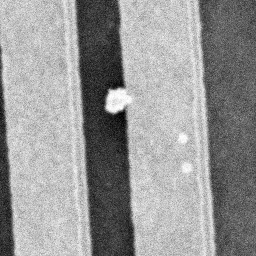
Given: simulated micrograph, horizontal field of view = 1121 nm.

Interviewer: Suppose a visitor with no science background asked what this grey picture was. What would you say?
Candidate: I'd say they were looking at lines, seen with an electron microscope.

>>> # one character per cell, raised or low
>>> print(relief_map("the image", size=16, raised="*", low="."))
*****...****....
*****...****....
*****...****....
*****...*****...
*****...*****...
*****..******...
*****..******...
*****...*****...
*****...*****...
.****...*****...
.****...*****...
.****...*****...
.****...*****...
.*****..*****...
.*****..*****...
.*****..*****...